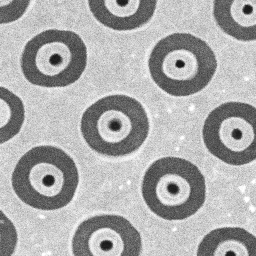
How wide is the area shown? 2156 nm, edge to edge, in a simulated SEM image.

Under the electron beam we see ring-shaped grooves with a dot in the middle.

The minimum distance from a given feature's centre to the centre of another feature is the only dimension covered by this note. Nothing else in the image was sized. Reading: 87.2 px